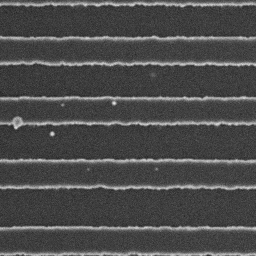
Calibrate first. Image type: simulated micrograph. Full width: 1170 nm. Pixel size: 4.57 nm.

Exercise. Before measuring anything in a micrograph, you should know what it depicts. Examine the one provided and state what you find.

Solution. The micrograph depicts lines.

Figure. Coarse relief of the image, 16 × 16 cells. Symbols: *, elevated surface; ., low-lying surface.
................
................
****************
****************
................
................
****************
****************
................
................
****************
****************
................
................
****************
****************